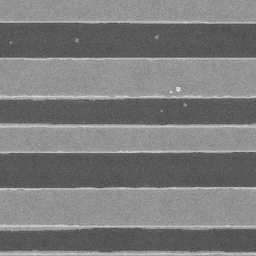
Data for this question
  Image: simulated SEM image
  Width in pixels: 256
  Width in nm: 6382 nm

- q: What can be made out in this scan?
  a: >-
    lines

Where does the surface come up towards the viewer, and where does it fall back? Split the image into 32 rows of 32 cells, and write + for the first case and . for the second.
++++++++++++++++++++++++++++++++
++++++++++++++++++++++++++++++++
++++++++++++++++++++++++++++++++
................................
................................
................................
................................
++++++++++++++++++++++++++++++++
++++++++++++++++++++++++++++++++
++++++++++++++++++++++++++++++++
++++++++++++++++++++++++++++++++
++++++++++++++++++++++++++++++++
................................
................................
................................
................................
++++++++++++++++++++++++++++++++
++++++++++++++++++++++++++++++++
++++++++++++++++++++++++++++++++
................................
................................
................................
................................
..........++..++++..++++++++++++
++++++++++++++++++++++++++++++++
++++++++++++++++++++++++++++++++
++++++++++++++++++++++++++++++++
++++++++++++++++++++++++++++++++
.++.............................
................................
................................
................................